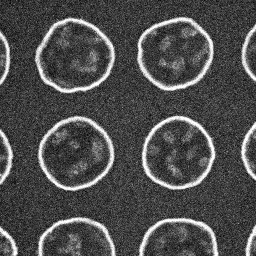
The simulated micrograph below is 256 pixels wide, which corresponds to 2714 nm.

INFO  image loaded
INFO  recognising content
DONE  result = raised bodies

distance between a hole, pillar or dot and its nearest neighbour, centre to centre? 1050 nm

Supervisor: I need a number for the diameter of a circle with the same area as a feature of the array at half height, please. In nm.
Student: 747